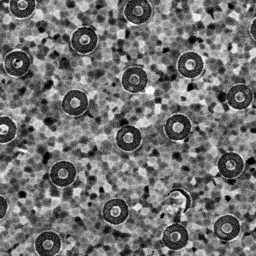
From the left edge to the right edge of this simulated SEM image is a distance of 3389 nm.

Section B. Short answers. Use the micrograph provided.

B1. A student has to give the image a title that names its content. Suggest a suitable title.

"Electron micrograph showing a regular array of ring-shaped grooves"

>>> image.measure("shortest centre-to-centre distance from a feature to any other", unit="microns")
0.779